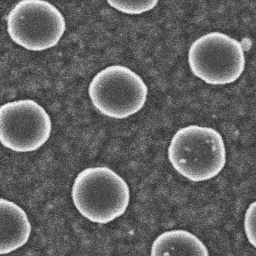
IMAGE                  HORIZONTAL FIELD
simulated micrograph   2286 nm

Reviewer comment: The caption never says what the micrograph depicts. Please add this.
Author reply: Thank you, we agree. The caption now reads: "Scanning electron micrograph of raised bodies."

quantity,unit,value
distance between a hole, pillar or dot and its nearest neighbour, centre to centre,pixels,98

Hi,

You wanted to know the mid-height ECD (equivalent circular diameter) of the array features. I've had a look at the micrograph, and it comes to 0.476 microns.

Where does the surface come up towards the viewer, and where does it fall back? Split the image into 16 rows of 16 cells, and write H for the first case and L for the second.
LHHLLLLHHLLLLLLL
LHHHLLLLLLLLLLLL
LHHHLLLLLLLLHHHL
LLLLLLLLLLLLHHHL
LLLLLLHHLLLLHHHL
LLLLLLHHHLLLLLLL
LHLLLLHHHLLLLLLL
HHHLLLLLLLLLLLLL
HHHLLLLLLLLHHHLL
LLLLLLLLLLLHHHLL
LLLLLLLLLLLHHHLL
LLLLLHHHLLLLLLLL
LLLLLHHHLLLLLLLL
HHLLLHHLLLLLLLLH
HHLLLLLLLLLLLLLH
HLLLLLLLLLHHHLLL